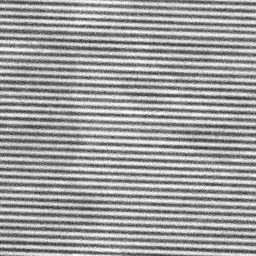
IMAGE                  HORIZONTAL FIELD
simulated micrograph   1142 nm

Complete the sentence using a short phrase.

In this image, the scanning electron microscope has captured parallel lines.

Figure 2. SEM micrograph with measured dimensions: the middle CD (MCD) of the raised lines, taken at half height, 11.2 nanometers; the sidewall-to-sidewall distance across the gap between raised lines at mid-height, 22.9 nm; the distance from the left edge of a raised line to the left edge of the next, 32.5 nanometres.